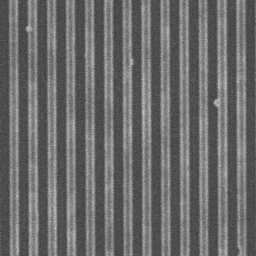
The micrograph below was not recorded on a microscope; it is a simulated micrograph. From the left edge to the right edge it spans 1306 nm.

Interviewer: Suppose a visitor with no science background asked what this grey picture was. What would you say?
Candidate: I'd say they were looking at parallel lines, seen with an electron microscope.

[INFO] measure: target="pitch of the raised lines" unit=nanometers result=96.7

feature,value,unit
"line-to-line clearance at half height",0.0587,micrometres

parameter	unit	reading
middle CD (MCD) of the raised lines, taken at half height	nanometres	34.4